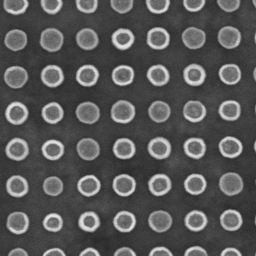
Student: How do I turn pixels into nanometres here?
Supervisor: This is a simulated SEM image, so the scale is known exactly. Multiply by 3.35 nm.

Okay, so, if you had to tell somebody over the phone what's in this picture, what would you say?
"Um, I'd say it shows a regular array of raised bodies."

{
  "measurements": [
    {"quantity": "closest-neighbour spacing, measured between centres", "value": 119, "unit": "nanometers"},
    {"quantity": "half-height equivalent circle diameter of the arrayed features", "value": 72.8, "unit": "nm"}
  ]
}